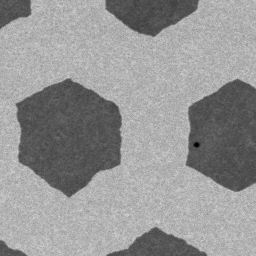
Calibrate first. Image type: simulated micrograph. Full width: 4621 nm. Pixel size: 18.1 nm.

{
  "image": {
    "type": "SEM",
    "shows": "holes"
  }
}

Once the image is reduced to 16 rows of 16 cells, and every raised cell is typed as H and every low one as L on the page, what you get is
LLHHHHHLLLLLHHHH
LHHHHHHHLLLHHHHH
HHHHHHHHHHHHHHHH
HHHHHHHHHHHHHHHH
HHHHHHHHHHHHHHHH
HHHLLHHHHHHHHHLL
HLLLLLLHHHHHLLLL
HLLLLLLLHHHHLLLL
HLLLLLLLHHHHLLLL
HLLLLLLLHHHHLLLL
HHLLLLLHHHHHLLLL
HHHLLHHHHHHHHHLL
HHHHHHHHHHHHHHHH
HHHHHHHHHHHHHHHH
HHHHHHHHHLHHHHHH
LHHHHHHHLLLLHHHH